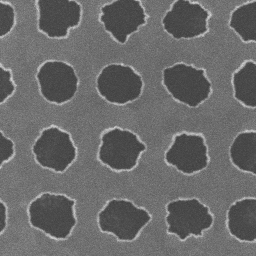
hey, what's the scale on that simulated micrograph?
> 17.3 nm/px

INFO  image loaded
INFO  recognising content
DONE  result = a regular array of holes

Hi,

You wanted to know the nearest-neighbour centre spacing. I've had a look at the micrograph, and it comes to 1120 nm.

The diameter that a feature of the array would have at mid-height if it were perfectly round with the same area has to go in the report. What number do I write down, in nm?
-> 733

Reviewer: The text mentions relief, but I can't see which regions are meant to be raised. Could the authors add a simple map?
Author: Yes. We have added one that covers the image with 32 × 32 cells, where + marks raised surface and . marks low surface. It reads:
.++++.....++++...+++++...++++++.
..+++.....+++.....+++.....+++...
..+++.....+++.....++......+++...
.++++....++++....++++.....+++...
++++++..++++++..++++++...+++++..
++++++++++++++++++++++++++++++++
++++++++++++++++++++++++++++++++
++++++++++++++++++++++++++++++++
+++++....++++...+++++...++++++..
.++++.....++.....+++......+++...
..+++.....++......+++.....+++...
..+++....+++......+++.....+++...
.+++++...++++....+++++....++++..
++++++++++++++++++++++++++++++++
++++++++++++++++++++++++++++++++
++++++++++++++++++++++++++++++++
+++++...+++++...+++++++++++++++.
.++++....++++....+++++....+++...
..++.....++++.....+++.....+++...
..++.....+++.....++++.....+++...
+++++....++++....++++.....+++...
+++++++.+++++++++++++++.+++++++.
++++++++++++++++++++++++++++++++
++++++++++++++++++++++++++++++++
+++++...++++++++++++++++++++++++
++++.....++++....++++....++++...
.+++.....++++.....+++.....+++...
.+++.....+++.......++......+....
.+++.....++++.....+++.....+++...
++++++..++++++...+++++..+++++...
++++++++++++++++++++++++++++++++
++++++++++++++++++++++++++++++++